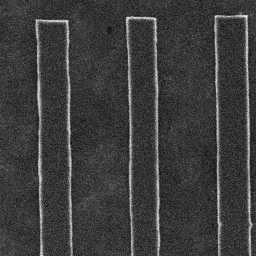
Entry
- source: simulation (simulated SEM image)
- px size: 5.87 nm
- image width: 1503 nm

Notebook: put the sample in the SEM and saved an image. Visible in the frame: one or a few lines or trenches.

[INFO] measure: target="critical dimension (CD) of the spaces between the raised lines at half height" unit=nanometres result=350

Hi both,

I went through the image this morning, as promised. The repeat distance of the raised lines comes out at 524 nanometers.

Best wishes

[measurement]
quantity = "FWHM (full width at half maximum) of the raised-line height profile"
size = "183 nanometers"